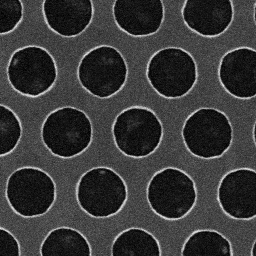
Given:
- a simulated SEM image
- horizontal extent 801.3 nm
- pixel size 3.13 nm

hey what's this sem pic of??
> a regular array of holes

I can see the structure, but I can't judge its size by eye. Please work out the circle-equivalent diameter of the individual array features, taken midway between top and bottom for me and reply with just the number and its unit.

153 nm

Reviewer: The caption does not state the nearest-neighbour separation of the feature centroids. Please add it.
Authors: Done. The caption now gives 217 nm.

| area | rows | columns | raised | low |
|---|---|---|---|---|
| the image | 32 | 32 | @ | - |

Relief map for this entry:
---@@------@@@------@@@------@@@
---@@------@@@------@@@------@@@
---@@@-----@@@------@@@------@@@
--@@@@-----@@@@-----@@@@----@@@@
@@@@@@@@-@@@@@@@@@@@@@@@@@@@@@@@
@@@@@@@@@@@@@@@@@@@@@@@@@@@@@@@@
@@----@@@@@----@@@@@---@@@@@@---
@------@@@-----@@@@-----@@@@----
@------@@@------@@@-----@@@@----
@------@@@------@@-------@@-----
@@-----@@@-----@@@@-----@@@@----
@@----@@@@@----@@@@@---@@@@@@---
@@@@@@@@@@@@@@@@@@@@@@@@@@@@@@@@
-@@@@@@@-@@@@@@@@-@@@@@@@@@@@@@@
--@@@@-----@@@@----@@@@@----@@@@
--@@@------@@@------@@@------@@@
---@@------@@@------@@@------@@@
--@@@------@@@------@@@------@@@
--@@@@-----@@@@----@@@@@----@@@@
@@@@@@@--@@@@@@@--@@@@@@@--@@@@@
@@@@@@@@@@@@@@@@@@@@@@@@@@@@@@@@
@@---@@@@@@---@@@@@@---@@@@@@---
@-----@@@@-----@@@@-----@@@@----
@------@@@------@@@-----@@@-----
@------@@@------@@------@@@-----
@-----@@@@-----@@@@-----@@@@----
@@----@@@@@----@@@@----@@@@@----
@@@@@@@@@@@@@@@@@@@@@@@@@@@@@@@@
@@@@@@@@@@@@@@@@@@@@@@@@@@@@@@@@
--@@@@----@@@@@----@@@@@----@@@@
--@@@------@@@------@@@------@@@
--@@@------@@@------@@@------@@@